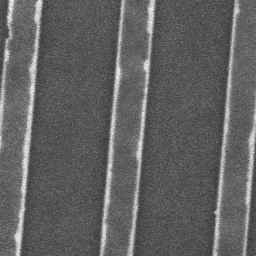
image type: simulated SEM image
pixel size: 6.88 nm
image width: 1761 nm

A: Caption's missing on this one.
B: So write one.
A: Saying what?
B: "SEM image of one or a few lines or trenches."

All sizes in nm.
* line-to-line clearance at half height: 564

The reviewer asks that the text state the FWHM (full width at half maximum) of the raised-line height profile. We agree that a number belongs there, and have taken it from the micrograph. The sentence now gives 208 nm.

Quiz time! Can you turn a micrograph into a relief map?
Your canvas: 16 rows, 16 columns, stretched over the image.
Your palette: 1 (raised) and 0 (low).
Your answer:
0110000011000001
0100000011000001
0100000110000001
1100000110000011
1100000110000011
1100000110000011
1100000110000011
1100000110000011
1100000110000011
1100000110000011
1100000110000011
1100000110000011
1000000110000011
1000000110000010
1000001100000110
1000001100000110